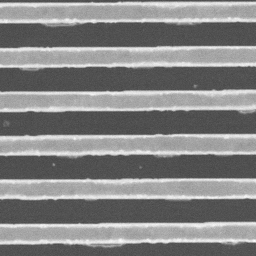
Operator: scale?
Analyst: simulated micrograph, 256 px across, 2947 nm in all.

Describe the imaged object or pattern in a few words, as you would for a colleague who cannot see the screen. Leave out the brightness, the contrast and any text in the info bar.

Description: lines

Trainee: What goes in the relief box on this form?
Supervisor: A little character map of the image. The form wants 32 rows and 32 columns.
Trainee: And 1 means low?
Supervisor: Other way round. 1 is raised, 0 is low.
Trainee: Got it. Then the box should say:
11111111111111111111111111111111
11111111111111111111111111111111
11111111111111111111111111111111
00000000000000000000000000000000
00000000000000000000000000000000
00000000000000000000000000000000
11111111111111111111111111111111
11111111111111111111111111111111
00000000000000000000000000000000
00000000000000000000000000000000
00000000000000000000000000000000
00000000000000001111111111111111
11111111111111111111111111111111
11111111111111111111111111111111
00000000000000000000000000000000
00000000000000000000000000000000
00000000000000000000000000000000
11111111111111111111111111111111
11111111111111111111111111111111
00000000000000000000000000000000
00000000000000000000000000000000
00000000000000000000000000000000
00000000000000000010111111111111
11111111111111111111111111111111
11111111111111111111111111111111
00000000000000000000000000000000
00000000000000000000000000000000
00000000000000000000000000000000
11111111111111111111111111111111
11111111111111111111111111111111
00000000000000000000000000000000
00000000000000000000000000000000